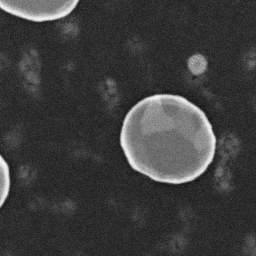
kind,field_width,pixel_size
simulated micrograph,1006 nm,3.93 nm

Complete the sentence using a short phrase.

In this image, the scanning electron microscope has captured raised bodies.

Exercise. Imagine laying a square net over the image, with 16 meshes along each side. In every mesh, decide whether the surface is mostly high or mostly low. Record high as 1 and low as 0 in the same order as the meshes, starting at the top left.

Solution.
1111000000000000
0000000000000000
0000000000000000
0000000000000000
0000000000000000
0000000000000000
0000000001110000
0000000011111000
0000000011111000
0000000011111000
0000000001111000
0000000000000000
0000000000000000
0000000000000000
0000000000000000
0000000000000000